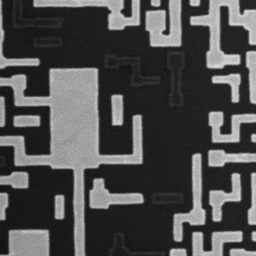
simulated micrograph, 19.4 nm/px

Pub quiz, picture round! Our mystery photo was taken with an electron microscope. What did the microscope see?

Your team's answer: wiring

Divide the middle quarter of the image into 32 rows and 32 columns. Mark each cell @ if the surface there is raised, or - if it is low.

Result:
----------@@@@---@@-------@@@@--
@@@@@@@@---------@@--------@@---
@@@@@@@@---------@@--------@@---
@@@@@@@@---------@@@-@@@---@@---
@@@@@@@@---------@@@@@@@---@@---
@@@@@@@@-------------------@@---
@@@@@@@@-------------------@@---
@@@@@@@@-------------------@@---
@@@@@@@@----@@-------------@@---
@@@@@@@@----@@-------------@@---
@@@@@@@@----@@------------------
@@@@@@@@----@@------------------
@@@@@@@@----@@------------------
@@@@@@@@@---@@---@@-------------
@@@@@@@@@---@@---@@-------------
@@@@@@@@@--------@@-------------
@@@@@@@@@--------@@-------------
@@@@@@@@@--------@@-------------
@@@@@@@@@--------@@-------------
@@@@@@@@@--------@@-------------
@@@@@@@@@--------@@-------------
@@@@@@@@@--------@@-------------
@@@@@@@@@--------@@-------------
@@@@@@@@@@@@@@@@@@@-------------
@@@@@@@@@@@@@@@@@@@-------------
@@@@@@@@@-----------------------
--@@@---------------------------
---@@---------------------------
---@@---------------------------
---@@---@@----------------------
---@@---@@----------------------
---@@--@@@@---------------------